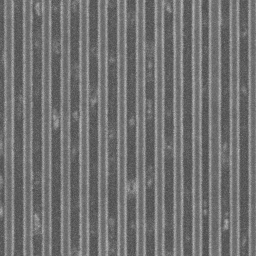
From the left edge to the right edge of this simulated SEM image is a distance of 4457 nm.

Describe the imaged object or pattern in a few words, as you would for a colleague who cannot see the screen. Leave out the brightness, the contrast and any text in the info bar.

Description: parallel lines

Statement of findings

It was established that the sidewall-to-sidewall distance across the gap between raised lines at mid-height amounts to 189 nm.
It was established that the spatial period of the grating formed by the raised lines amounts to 328 nanometers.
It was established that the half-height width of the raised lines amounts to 137 nm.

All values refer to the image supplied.